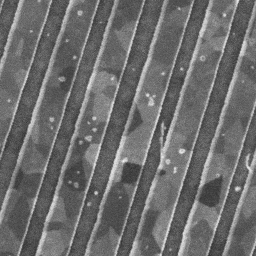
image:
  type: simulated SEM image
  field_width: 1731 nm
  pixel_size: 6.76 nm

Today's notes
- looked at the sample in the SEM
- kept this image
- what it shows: lines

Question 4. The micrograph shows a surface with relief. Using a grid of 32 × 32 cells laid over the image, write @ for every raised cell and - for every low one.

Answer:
--@@@@---@@@--@@@@---@@@--@@@@--
--@@@@--@@@@--@@@@--@@@@--@@@---
--@@@@--@@@@--@@@---@@@@--@@@--@
--@@@---@@@--@@@@---@@@--@@@@--@
-@@@@--@@@@--@@@@--@@@@--@@@@--@
-@@@@--@@@@--@@@---@@@@--@@@---@
-@@@---@@@---@@@---@@@--@@@@--@@
@@@@--@@@@--@@@@---@@@--@@@@--@@
@@@@--@@@@--@@@@--@@@@--@@@---@@
@@@---@@@---@@@---@@@--@@@@--@@@
@@@--@@@@--@@@@--@@@@--@@@@--@@@
@@@--@@@@--@@@@--@@@@--@@@---@@@
@@---@@@---@@@---@@@--@@@@--@@@@
@@---@@@--@@@@---@@@--@@@@--@@@@
@@--@@@@--@@@@--@@@@--@@@---@@@@
@---@@@@--@@@---@@@@--@@@---@@@-
@---@@@--@@@@---@@@--@@@@--@@@@-
@--@@@@--@@@@--@@@@--@@@@--@@@@-
@--@@@@--@@@@--@@@@--@@@--@@@@--
---@@@---@@@---@@@--@@@@--@@@@--
--@@@@--@@@@--@@@@--@@@@--@@@@--
--@@@@--@@@@--@@@@--@@@--@@@@--@
--@@@---@@@---@@@--@@@@--@@@@--@
-@@@@--@@@@--@@@@--@@@@--@@@@--@
-@@@@--@@@@--@@@@--@@@---@@@--@@
-@@@---@@@---@@@--@@@@--@@@@--@@
@@@@--@@@@---@@@--@@@@--@@@@--@@
@@@@--@@@@--@@@@--@@@---@@@--@@@
@@@---@@@---@@@@-@@@@--@@@@--@@@
@@@--@@@@---@@@--@@@@--@@@@--@@@
@@@--@@@@--@@@@--@@@@--@@@--@@@@
@@---@@@@--@@@@--@@@---@@@--@@@@